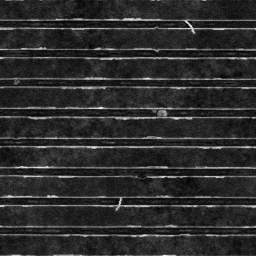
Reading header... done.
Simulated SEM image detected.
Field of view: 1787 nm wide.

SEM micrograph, parallel lines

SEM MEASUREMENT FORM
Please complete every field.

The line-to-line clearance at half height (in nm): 55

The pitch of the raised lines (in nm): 206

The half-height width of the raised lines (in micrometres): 0.154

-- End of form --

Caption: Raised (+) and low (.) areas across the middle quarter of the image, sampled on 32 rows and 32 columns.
++++++++++++++++++++++++++++++++
++++++++++++++++++++++++++++++++
++++++++++++++++++++++++++++++++
++++++++++++++++++++++++++++++++
................................
................................
++++++++++++++++++++++++++++++++
++++++++++++++++++++++++++++++++
++++++++++++++++++++++++++++++++
++++++++++++++++++++++++++++++++
++++++++++++++++++++++++++++++++
................................
........................+.......
+++++++++++++++++++..+++++++.+++
++++++++++++++++++++++++++++++++
++++++++++++++++++++++++++++++++
++++++++++++++++++++++++++++++++
++++++++++++++++++++++++++++++++
++++++++++++++++++++++++++++++++
................................
................................
++++++++++++++++++++++++++++++++
++++++++++++++++++++++++++++++++
++++++++++++++++++++++++++++++++
++++++++++++++++++++++++++++++++
++++++++++++++++++++++++++++++++
................................
................................
+++++++++++++++++++.++++++++++++
++++++++++++++++++++++++++++++++
++++++++++++++++++++++++++++++++
++++++++++++++++++++++++++++++++